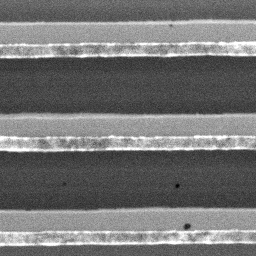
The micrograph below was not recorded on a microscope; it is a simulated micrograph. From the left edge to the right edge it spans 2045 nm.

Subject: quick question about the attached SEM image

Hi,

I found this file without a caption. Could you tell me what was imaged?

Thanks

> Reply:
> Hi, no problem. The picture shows lines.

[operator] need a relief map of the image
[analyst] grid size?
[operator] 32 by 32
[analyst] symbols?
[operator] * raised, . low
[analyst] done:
................................
................................
................................
********************************
********************************
********************************
********************************
................................
................................
................................
................................
................................
................................
................................
........................********
********************************
********************************
********************************
********************************
................................
................................
................................
................................
................................
................................
................................
**.........*********************
********************************
********************************
********************************
***********.*****...............
................................